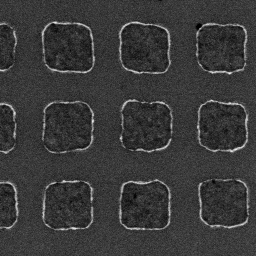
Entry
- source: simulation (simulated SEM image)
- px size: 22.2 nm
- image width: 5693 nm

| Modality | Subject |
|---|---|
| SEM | a regular array of raised bodies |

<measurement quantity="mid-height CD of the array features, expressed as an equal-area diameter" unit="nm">1180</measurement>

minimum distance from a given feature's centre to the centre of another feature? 1700 nm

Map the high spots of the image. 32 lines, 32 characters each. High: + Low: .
................................
................................
................................
+.....+++++....+++++.....+++++..
++...++++++....++++++....++++++.
++...+++++++...++++++....++++++.
++...+++++++...++++++....++++++.
++....++++++...++++++....++++++.
+.....+++++.....+++++....+++++..
................................
................................
................................
................................
+.....+++++....++++++....+++++..
++....++++++...++++++....++++++.
++....++++++...++++++....++++++.
++...+++++++...++++++....++++++.
++...++++++....++++++....++++++.
++....+++++.....++++......++++..
................................
................................
................................
..........................++....
++....+++++....++++++....++++++.
++....+++++....++++++....++++++.
++...++++++....++++++....++++++.
++...++++++....++++++....++++++.
++...++++++....++++++....++++++.
......+++++.....++++............
................................
................................
................................